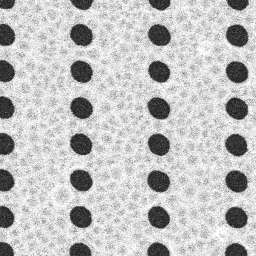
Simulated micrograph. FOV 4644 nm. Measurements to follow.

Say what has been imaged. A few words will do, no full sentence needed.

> a regular array of holes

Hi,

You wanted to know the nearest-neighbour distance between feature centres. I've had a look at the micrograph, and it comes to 659 nm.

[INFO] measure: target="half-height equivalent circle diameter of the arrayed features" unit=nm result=411